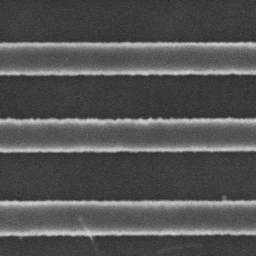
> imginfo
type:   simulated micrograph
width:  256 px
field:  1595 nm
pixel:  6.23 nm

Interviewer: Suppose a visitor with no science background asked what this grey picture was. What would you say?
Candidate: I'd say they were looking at lines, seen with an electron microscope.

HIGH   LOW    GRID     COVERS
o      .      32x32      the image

................................
................................
................................
................................
................................
oooooooooooooooooooooooooooooooo
oooooooooooooooooooooooooooooooo
oooooooooooooooooooooooooooooooo
oooooooooooooooooooooooooooooooo
................................
................................
................................
................................
................................
................................
oooooooooooooooooooooooooooooooo
oooooooooooooooooooooooooooooooo
oooooooooooooooooooooooooooooooo
oooooooooooooooooooooooooooooooo
................................
................................
................................
................................
................................
................................
oooooooooooooooooooooooooooooooo
oooooooooooooooooooooooooooooooo
oooooooooooooooooooooooooooooooo
oooooooooooooooooooooooooooooooo
................................
................................
................................